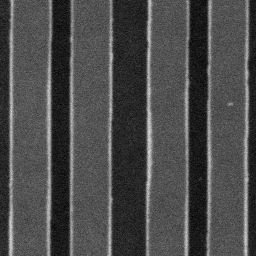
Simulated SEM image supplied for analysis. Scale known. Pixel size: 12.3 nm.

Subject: lines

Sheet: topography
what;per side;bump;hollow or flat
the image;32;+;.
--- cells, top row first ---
.+++++...+++++.....+++++..+++++.
.+++++...+++++.....+++++..+++++.
.+++++...+++++.....+++++..+++++.
.+++++...+++++.....+++++..+++++.
.+++++...+++++.....++++...+++++.
.+++++...+++++.....++++...+++++.
.+++++...+++++.....++++...+++++.
.+++++...+++++....+++++...+++++.
.+++++...+++++....+++++...+++++.
.+++++...+++++.....++++...+++++.
.+++++...+++++.....++++...+++++.
.+++++...+++++.....++++...+++++.
.+++++...+++++....+++++...+++++.
.+++++...+++++....+++++...+++++.
.+++++...+++++....+++++...+++++.
.+++++...+++++....+++++...+++++.
.+++++...+++++....+++++...+++++.
.+++++...+++++....+++++...+++++.
.+++++...+++++....+++++...+++++.
.+++++...+++++....+++++...+++++.
.+++++...+++++....+++++...+++++.
.+++++...+++++....+++++...+++++.
.+++++...+++++....+++++...+++++.
.+++++...+++++....+++++...+++++.
.+++++...+++++....+++++...+++++.
.+++++...+++++....+++++...+++++.
.+++++...+++++....+++++...+++++.
.+++++...+++++....+++++...+++++.
.+++++...+++++....+++++...+++++.
.+++++...+++++....+++++...+++++.
.+++++...+++++....+++++...+++++.
.+++++...+++++....+++++...+++++.